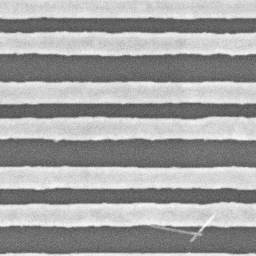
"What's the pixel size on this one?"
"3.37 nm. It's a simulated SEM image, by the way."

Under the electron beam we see lines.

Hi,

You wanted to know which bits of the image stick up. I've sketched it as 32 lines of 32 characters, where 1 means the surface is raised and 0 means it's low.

11111111111111111111111111111111
11111111111111111111111111111111
00000000000000000000000000000000
00000000000000000000000000000000
11111111111111111111111111111111
11111111111111111111111111111111
11111111111111111111111111111111
00000000000000000000000000000000
00000000000000000000000000000000
00000000000000000000000000000000
01011101111101111111110001111111
11111111111111111111111111111111
11111111111111111111111111111111
00000000000000000000000000000000
00000000000000000000000000000000
11111111111111111111111111111111
11111111111111111111111111111111
00000000000000000000000000000000
00000000000000000000000000000000
00000000000000000000000000000000
00000000000000000000000000000000
11111111111111111111111111111111
11111111111111111111111111111111
00001100000000000000000000000011
00000000000000000000000000000000
00000000000000000110000000011100
11111111111111111111111111111111
11111111111111111111111111111111
00000000000000000000000000000000
00000000000000000000000000000000
00000000000000000000000000000000
00000000000000000000000000000000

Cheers